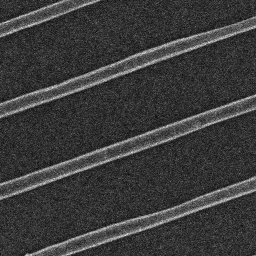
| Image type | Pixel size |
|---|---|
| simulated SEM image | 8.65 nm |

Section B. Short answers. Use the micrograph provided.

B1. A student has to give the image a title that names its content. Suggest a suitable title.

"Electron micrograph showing one or a few lines or trenches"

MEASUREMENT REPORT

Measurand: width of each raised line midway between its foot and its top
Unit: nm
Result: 104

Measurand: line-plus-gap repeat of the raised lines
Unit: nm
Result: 663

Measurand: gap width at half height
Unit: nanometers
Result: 557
